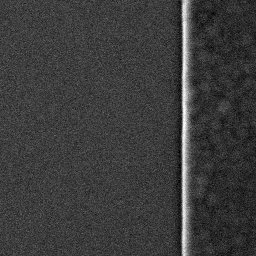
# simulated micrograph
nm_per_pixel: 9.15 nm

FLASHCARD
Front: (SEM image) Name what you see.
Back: wiring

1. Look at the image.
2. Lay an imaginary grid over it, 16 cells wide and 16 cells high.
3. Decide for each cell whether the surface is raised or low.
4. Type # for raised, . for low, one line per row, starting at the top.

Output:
...........#####
...........#####
............####
............####
...........#####
...........#####
...........#####
............####
...........#####
...........#####
...........#####
...........#####
...........#####
...........#####
...........#####
...........#####